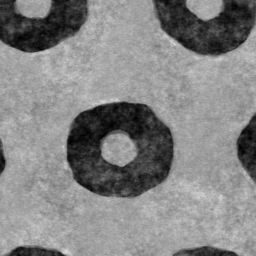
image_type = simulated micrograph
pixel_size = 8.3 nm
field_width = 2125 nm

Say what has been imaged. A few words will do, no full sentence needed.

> ring-shaped grooves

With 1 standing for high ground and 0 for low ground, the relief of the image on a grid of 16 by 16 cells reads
0110011111001100
0000011111000000
0000111111100001
1111111111111111
1111111111111111
1111111111111111
1111111001111111
1111100000111111
1111000100011110
1111001100011110
1111000000011110
1111100000111111
1111111111111111
1111111111111111
1111111111111111
1001111111110111